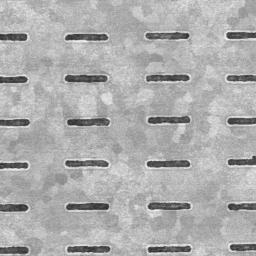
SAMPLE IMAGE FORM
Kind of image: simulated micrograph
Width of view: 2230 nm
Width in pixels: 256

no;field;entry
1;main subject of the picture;a regular array of holes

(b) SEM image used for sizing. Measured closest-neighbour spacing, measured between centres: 41.8 pixels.